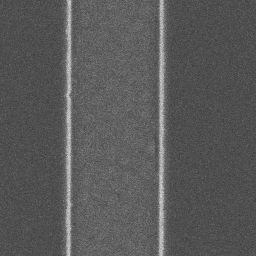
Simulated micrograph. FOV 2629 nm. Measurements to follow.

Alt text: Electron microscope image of one or a few lines or trenches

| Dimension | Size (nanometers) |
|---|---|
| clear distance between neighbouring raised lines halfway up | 945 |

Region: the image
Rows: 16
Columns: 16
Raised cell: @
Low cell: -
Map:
@@@@------@@@@@@
@@@@------@@@@@@
@@@@------@@@@@@
@@@@------@@@@@@
@@@@------@@@@@@
@@@@------@@@@@@
@@@@------@@@@@@
@@@@------@@@@@@
@@@@------@@@@@@
@@@@------@@@@@@
@@@@------@@@@@@
@@@@------@@@@@@
@@@@------@@@@@@
@@@@------@@@@@@
@@@@------@@@@@@
@@@@------@@@@@@